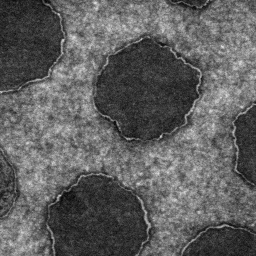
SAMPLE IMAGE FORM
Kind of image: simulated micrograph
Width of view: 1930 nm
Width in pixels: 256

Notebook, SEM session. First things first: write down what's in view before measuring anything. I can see raised bodies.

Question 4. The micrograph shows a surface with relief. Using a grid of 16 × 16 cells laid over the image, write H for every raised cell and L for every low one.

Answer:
HHHLLLLLLLLLLLLL
HHHHLLLLLLLLLLLL
HHHHLLLLLHLLLLLL
HHHHLLLHHHHLLLLL
HHHLLLHHHHHHLLLL
HLLLLLHHHHHHLLLL
LLLLLLHHHHHHLLLL
LLLLLLLHHHHHLLLH
LLLLLLLLHHLLLLLH
LLLLLLLLLLLLLLLH
HLLLLLLLLLLLLLLH
LLLLLHHLLLLLLLLL
LLLHHHHHHLLLLLLL
LLLHHHHHHLLLLLLL
LLLHHHHHHLLLLHHH
LLLHHHHHHLLLHHHH